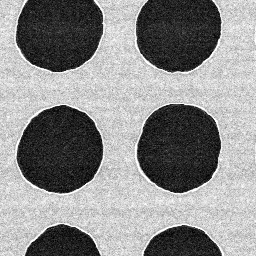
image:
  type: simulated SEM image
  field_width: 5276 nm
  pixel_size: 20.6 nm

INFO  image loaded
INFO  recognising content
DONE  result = holes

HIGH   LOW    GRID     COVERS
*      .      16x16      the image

*.....***.....**
*.....***.....**
*.....***.....**
*.....***....***
***********.****
****************
****************
**....***....***
*.....***.....**
*.....***.....**
*.....***.....**
**...*****...***
****************
****************
***..*****...***
**....***.....**